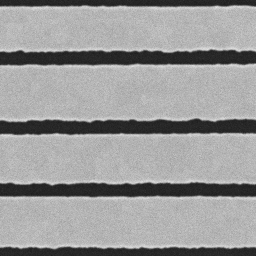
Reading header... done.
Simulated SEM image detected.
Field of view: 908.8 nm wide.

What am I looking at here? lines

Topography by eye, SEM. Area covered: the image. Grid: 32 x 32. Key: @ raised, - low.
--------------------------------
@@@@@@@@@@@@@@@@@@@@@@@@@@@@@@@@
@@@@@@@@@@@@@@@@@@@@@@@@@@@@@@@@
@@@@@@@@@@@@@@@@@@@@@@@@@@@@@@@@
@@@@@@@@@@@@@@@@@@@@@@@@@@@@@@@@
@@@@@@@@@@@@@@@@@@@@@@@@@@@@@@@@
--------------------------------
--------------------------------
@@@@@@@@@@@@@@@@@@@@@@@@@@@@@@@@
@@@@@@@@@@@@@@@@@@@@@@@@@@@@@@@@
@@@@@@@@@@@@@@@@@@@@@@@@@@@@@@@@
@@@@@@@@@@@@@@@@@@@@@@@@@@@@@@@@
@@@@@@@@@@@@@@@@@@@@@@@@@@@@@@@@
@@@@@@@@@@@@@@@@@@@@@@@@@@@@@@@@
@@@@@@@@@@@@@@@@@@@@@@@@@@@@@@@@
--------------------------------
--------------------------------
@@@@@@@@@@@@@@@@@@@@@@@@@@@@@@@@
@@@@@@@@@@@@@@@@@@@@@@@@@@@@@@@@
@@@@@@@@@@@@@@@@@@@@@@@@@@@@@@@@
@@@@@@@@@@@@@@@@@@@@@@@@@@@@@@@@
@@@@@@@@@@@@@@@@@@@@@@@@@@@@@@@@
@@@@@@@@@@@@@@@@@@@@@@@@@@@@@@@@
--------------------------------
--------------------------------
@@@@@@@@@@@@@@@@@@@@@@@@@@@@@@@@
@@@@@@@@@@@@@@@@@@@@@@@@@@@@@@@@
@@@@@@@@@@@@@@@@@@@@@@@@@@@@@@@@
@@@@@@@@@@@@@@@@@@@@@@@@@@@@@@@@
@@@@@@@@@@@@@@@@@@@@@@@@@@@@@@@@
@@@@@@@@@@@@@@@@@@@@@@@@@@@@@@@@
--------------------------------